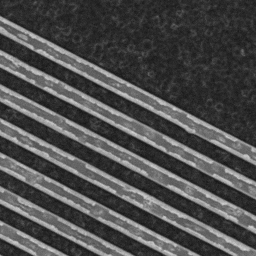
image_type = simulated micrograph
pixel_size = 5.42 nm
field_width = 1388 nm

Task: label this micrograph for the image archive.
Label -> parallel lines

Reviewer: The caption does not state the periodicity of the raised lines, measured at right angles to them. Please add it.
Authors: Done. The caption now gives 30.2 pixels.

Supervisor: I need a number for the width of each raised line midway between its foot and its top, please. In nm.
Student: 78.9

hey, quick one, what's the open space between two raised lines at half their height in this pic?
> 83.6 nm